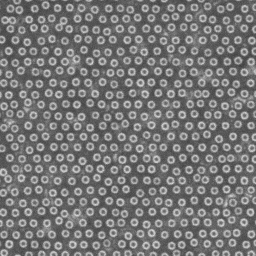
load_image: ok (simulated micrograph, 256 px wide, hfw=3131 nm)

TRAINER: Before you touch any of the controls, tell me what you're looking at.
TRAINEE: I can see a regular array of raised bodies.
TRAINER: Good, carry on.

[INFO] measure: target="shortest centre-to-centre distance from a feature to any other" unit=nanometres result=132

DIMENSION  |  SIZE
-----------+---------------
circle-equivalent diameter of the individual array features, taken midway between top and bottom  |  79.3 nanometres